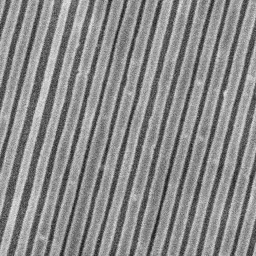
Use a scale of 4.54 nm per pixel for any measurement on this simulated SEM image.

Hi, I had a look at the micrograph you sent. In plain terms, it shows parallel lines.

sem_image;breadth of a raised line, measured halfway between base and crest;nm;50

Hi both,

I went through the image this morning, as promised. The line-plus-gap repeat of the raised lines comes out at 74.7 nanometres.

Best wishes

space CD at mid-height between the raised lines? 23.6 nm